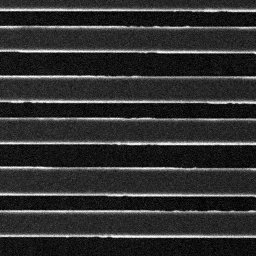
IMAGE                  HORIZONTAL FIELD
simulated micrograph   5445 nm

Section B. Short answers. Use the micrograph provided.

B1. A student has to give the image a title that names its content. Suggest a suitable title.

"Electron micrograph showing lines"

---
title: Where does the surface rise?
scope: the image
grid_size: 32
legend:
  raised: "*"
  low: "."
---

********************************
................................
................................
********************************
********************************
********************************
....................************
................................
................................
................................
********************************
********************************
********************************
................................
................................
********************************
********************************
********************************
................................
................................
................................
********************************
********************************
********************************
................................
................................
********************************
********************************
********************************
********************************
................................
................................